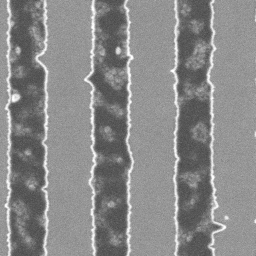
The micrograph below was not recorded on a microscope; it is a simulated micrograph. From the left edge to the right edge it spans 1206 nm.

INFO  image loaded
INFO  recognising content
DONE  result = one or a few lines or trenches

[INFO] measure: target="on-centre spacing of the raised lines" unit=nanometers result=393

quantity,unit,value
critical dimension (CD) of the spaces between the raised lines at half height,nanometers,215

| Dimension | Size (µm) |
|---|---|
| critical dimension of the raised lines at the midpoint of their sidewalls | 0.177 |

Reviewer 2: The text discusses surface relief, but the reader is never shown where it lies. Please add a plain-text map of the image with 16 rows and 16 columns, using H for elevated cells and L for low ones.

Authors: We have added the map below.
LHHLLLHHLLLHHLLL
LHHLLLHHLLLHHLLL
LHHLLLHHLLLHHLLL
LHHLLLHHLLLHHLLL
LHHLLLHHLLLHHLLL
LHHLLLHHLLLHHLLL
LHHLLLHHLLLHHLLL
LHHLLLHHLLLHHLLL
LHHLLLHHLLLHHLLL
LHHLLLHHLLLHHLLL
LHHLLLHHLLLHHLLL
HHHLLLHHLLLHHLLL
HHHLLLHHLLLHHLLL
HHHLLLHHLLLHHLLL
LHHLLLHHLLLHHHLL
LHHLLLHHLLLHHLLL